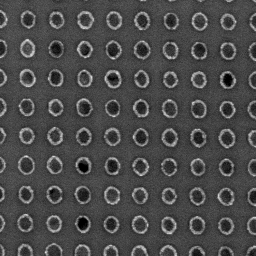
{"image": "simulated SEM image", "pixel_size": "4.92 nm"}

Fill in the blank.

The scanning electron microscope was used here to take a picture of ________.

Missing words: a regular array of raised bodies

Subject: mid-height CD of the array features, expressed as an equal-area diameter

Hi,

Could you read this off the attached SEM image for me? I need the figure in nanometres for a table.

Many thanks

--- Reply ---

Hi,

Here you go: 76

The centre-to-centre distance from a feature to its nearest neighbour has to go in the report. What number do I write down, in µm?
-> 0.141